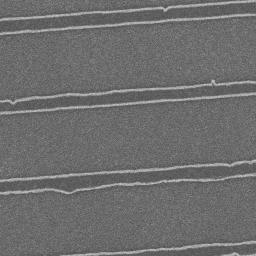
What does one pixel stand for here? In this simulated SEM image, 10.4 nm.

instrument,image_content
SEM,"one or a few lines or trenches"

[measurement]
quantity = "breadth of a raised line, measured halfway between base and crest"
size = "0.137 µm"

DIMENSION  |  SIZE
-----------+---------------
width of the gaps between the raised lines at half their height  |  67.3 px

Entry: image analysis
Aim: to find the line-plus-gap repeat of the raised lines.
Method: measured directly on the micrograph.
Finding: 836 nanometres